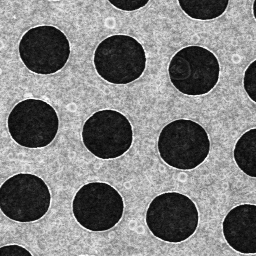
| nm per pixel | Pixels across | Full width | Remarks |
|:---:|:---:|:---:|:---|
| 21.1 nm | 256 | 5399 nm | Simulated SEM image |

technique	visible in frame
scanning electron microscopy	a regular array of holes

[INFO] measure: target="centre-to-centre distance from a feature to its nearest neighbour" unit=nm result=1560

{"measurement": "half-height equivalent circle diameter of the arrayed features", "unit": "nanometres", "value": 1060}